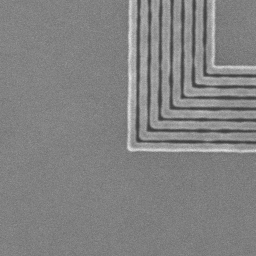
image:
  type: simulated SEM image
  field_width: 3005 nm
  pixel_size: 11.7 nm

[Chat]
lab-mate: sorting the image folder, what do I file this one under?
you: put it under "groups of lines, slits or small figures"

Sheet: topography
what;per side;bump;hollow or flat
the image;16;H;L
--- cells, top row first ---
LLLLLLLLHHHHHLLL
LLLLLLLLHHHHHLLL
LLLLLLLLHHHHHLLL
LLLLLLLLHHHHHLLL
LLLLLLLLHHHHHHHH
LLLLLLLLHHHHHHHH
LLLLLLLLHHHHHLLL
LLLLLLLLHHHHHHHH
LLLLLLLLHHHLHHLH
LLLLLLLLLLLLLLLL
LLLLLLLLLLLLLLLL
LLLLLLLLLLLLLLLL
LLLLLLLLLLLLLLLL
LLLLLLLLLLLLLLLL
LLLLLLLLLLLLLLLL
LLLLLLLLLLLLLLLL